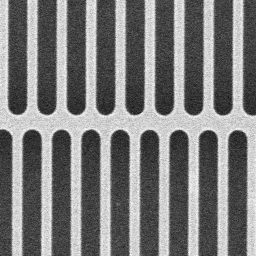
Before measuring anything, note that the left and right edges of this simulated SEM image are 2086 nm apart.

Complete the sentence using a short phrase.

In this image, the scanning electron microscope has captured groups of lines, slits or small figures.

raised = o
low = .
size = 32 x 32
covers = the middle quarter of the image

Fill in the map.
......oo.....oo.....ooo.....oo..
......oo.....oo.....ooo.....oo..
......oo.....oo.....ooo.....oo..
......oo.....oo.....ooo.....oo..
......oo.....oo.....ooo.....oo..
......oo.....oo.....ooo.....oo..
......oo.....oo.....ooo.....oo..
......oo.....oo.....ooo.....oo..
......oo.....oo.....ooo.....oo..
......oo.....oo.....ooo.....oo..
......oo.....oo.....ooo.....oo..
o....ooo.....ooo....ooo....ooo..
oo..ooooo...oooo...ooooo..ooooo.
oooooooooooooooooooooooooooooooo
oooooooooooooooooooooooooooooooo
oooooooooooooooooooooooooooooooo
oooooo..ooooo..oooooo.oooooo.ooo
.ooo.....ooo....ooo.....oo.....o
..oo.....ooo.....oo.....oo.....o
..oo.....oo......oo.....oo.....o
..oo.....oo......oo.....oo.....o
..oo.....oo......oo.....oo.....o
..oo.....oo......oo.....oo.....o
..oo.....oo......oo.....oo.....o
..oo.....oo......oo.....oo.....o
..oo.....oo......oo.....oo.....o
..oo.....oo......oo.....oo.....o
..oo.....oo......oo.....oo.....o
..oo.....oo......oo.....oo.....o
..oo.....oo......oo.....oo.....o
..oo.....oo......oo.....oo.....o
..oo.....oo......oo.....oo.....o